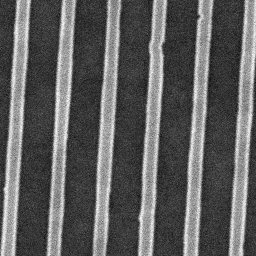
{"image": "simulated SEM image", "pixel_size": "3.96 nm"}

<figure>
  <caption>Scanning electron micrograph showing parallel lines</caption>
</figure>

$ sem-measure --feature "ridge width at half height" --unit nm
44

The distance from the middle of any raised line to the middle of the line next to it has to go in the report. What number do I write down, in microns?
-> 0.18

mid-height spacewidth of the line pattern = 34.2 pixels